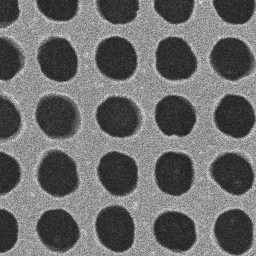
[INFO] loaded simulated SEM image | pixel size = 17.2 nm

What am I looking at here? a regular array of holes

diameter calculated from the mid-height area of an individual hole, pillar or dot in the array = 734 nm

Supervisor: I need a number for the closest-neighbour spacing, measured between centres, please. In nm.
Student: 971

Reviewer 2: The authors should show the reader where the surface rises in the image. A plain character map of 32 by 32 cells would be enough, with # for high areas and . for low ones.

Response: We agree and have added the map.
..###.....##.....##.....###.....
..###....###.....###....###.....
..#####..####....###....####...#
################################
#####################.##########
..###....###....####...####....#
..###....###.....###....##.....#
...##.....##.....##......#......
...##.....##.....###....###....#
..####...####...####....####...#
################################
################################
.####....####...####...#####...#
..##......##.....##.....###.....
..##......##.....##......##.....
..###.....##.....###....###.....
..###....####....###....####...#
################################
################################
.#####...####...####...#####..##
..###....###.....##.....###....#
..###.....##.....##.....###.....
..###.....##.....###....###.....
..###.....###....###....####...#
#######.########################
################################
.#####..####....#####.######...#
..###....###.....###....###....#
..###.....##.....##.....###.....
..###.....##.....##......##.....
..###....####....###....###....#
.######.######.#############...#